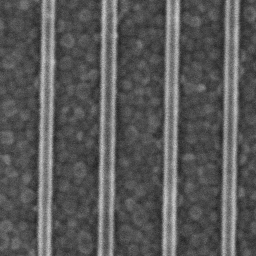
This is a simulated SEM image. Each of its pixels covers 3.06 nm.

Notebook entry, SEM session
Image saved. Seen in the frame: one or a few lines or trenches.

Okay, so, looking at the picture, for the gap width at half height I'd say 153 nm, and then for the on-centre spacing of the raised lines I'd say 187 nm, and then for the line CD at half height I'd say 32.1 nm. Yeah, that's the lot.